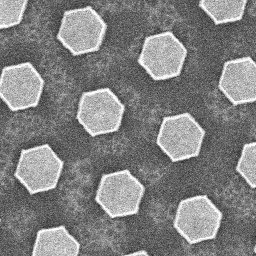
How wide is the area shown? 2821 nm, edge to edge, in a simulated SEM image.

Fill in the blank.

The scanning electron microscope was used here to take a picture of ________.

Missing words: raised bodies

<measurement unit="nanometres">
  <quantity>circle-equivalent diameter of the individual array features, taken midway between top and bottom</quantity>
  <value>492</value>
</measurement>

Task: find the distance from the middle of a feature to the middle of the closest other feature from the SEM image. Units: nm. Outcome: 916